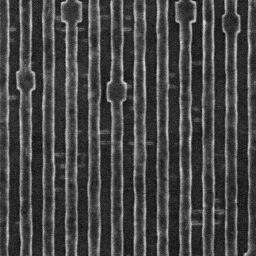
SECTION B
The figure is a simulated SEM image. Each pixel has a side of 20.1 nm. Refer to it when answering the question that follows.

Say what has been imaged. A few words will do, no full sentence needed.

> wiring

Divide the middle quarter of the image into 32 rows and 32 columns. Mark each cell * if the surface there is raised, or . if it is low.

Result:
.**...***...**....**...***...***
.**...***...***...**...***...***
.**...***...***...**...***...***
.**...***...***...**...***...***
.**...***..****...**...***...***
.**...***..****...**...***...***
.**...***..****...**...***...***
.**...***..****...**...***...***
.**...***..****...**...***...***
.**...***...***...**...***...***
.**...***...**....**...***...***
.**...***...**....**...***...**.
.**...***...***...**...***...**.
.**...***...***...**...***...**.
.**...***...***...**...***...***
.**...***...***...**...***...***
.**...***...***...**...***...***
.**...***...***...**...***...***
.**...***...**....**...***...**.
.**...***...**....**...***...**.
.**...***...**....**...***...**.
.**...***...**....**...***...**.
.**...***...***...**...***...**.
.**...***...***...**...***...**.
.**...***...***...**...***...**.
.**...***...***...**...***...**.
.**...***...***...**...***...***
.**...***...***...**...***...***
.**...***...***...**...***...***
.**...***...***...**...***...***
.**...***...***...**...***...***
.**...***...***...**...***...**.